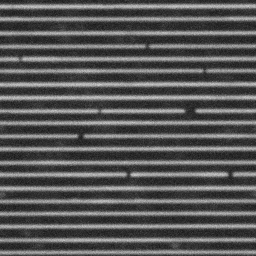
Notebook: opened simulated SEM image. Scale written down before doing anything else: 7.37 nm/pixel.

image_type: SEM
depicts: parallel lines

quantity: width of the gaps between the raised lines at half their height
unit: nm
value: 76.4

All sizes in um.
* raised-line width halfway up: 0.0212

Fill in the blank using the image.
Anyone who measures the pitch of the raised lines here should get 95.4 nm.